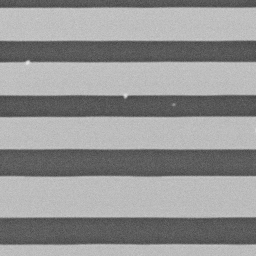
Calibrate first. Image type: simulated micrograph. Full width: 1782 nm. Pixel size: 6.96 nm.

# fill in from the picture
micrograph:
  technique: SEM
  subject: groups of lines, slits or small figures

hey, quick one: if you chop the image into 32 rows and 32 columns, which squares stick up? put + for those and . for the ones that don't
................................
++++++++++++++++++++++++++++++++
++++++++++++++++++++++++++++++++
++++++++++++++++++++++++++++++++
++++++++++++++++++++++++++++++++
................................
................................
................................
++++++++++++++++++++++++++++++++
++++++++++++++++++++++++++++++++
++++++++++++++++++++++++++++++++
++++++++++++++++++++++++++++++++
................................
................................
................................
++++++++++++++++++++++++++++++++
++++++++++++++++++++++++++++++++
++++++++++++++++++++++++++++++++
++++++++++++++++++++++++++++++++
................................
................................
................................
++++++++++++++++++++++++++++++++
++++++++++++++++++++++++++++++++
++++++++++++++++++++++++++++++++
++++++++++++++++++++++++++++++++
++++++++++++++++++++++++++++++++
................................
................................
................................
................................
++++++++++++++++++++++++++++++++